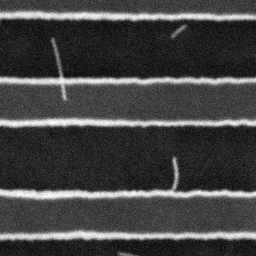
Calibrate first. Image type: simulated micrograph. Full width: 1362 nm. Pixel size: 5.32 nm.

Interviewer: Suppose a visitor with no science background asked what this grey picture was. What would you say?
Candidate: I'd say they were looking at lines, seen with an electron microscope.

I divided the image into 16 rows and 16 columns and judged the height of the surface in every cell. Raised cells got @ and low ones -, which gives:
@@@@@@@@@@@@@@@@
----------------
----------------
----------------
----------------
@@@@@@@@@@@@@@@@
@@@@@@@@@@@@@@@@
@@@@@@@@@@@@@@@@
----------------
----------------
----------------
----------------
@@@@@@@@@@@@@@@@
@@@@@@@@@@@@@@@@
@@@@@@@@@@@@@@@@
----------------